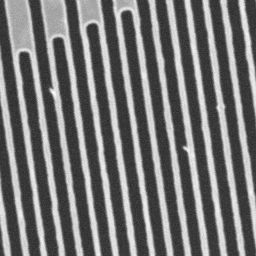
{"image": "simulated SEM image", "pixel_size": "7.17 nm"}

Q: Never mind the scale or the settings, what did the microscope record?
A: parallel lines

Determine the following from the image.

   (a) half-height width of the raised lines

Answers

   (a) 34.6 nm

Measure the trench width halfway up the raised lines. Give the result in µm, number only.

0.0896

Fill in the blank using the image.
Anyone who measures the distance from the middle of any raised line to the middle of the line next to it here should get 17.8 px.